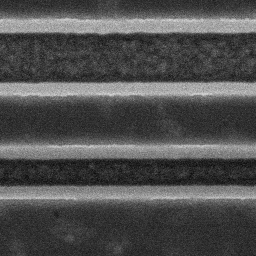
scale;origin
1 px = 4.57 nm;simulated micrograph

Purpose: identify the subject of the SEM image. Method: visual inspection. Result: one or a few lines or trenches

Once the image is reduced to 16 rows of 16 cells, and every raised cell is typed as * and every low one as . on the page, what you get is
****************
****************
................
................
................
.............**.
****************
****************
****************
***********....*
................
................
****************
****************
****************
****************